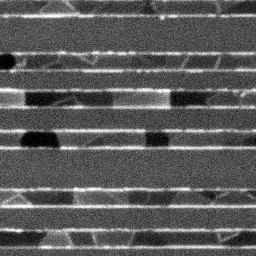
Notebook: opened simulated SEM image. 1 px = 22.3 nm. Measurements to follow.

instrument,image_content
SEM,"lines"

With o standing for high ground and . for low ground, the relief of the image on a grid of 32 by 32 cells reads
oooooooooooooooooooooooooooooooo
oooooooooooooooooooooooooooooooo
................................
................................
................................
................................
................................
oooooooooooooooooooooooooooooooo
oooooooooooooooooooooooooooooooo
................................
................................
oooooooooooooooooooooooooooooooo
oooooooooooooooooooooooooooooooo
................................
................................
................................
oooooooooooooooooooooooooooooooo
oooooooooooooooooooooooooooooooo
ooooooooooooo.oo.oooo.oooooo..o.
................................
................................
................................
................................
................................
oooooooooooooooooooooooooooooooo
oooooooooooooooooooooooooooooooo
................................
................................
................................
oooooooooooooooooooooooooooooooo
oooooooooooooooooooooooooooooooo
................................